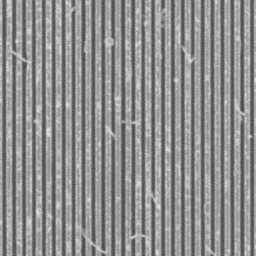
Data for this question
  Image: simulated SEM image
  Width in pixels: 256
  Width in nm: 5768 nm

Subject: parallel lines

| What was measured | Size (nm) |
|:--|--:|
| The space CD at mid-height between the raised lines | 121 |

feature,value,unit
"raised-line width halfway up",0.101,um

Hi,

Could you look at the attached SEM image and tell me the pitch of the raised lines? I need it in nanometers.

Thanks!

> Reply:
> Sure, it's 224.